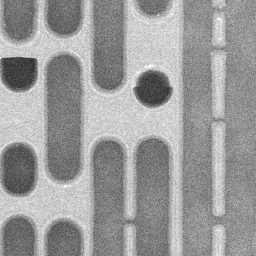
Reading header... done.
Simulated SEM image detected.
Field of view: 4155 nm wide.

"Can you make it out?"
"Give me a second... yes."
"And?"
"parallel lines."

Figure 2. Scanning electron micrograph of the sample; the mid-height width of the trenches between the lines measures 576 nm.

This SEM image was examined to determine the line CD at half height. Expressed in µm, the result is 0.128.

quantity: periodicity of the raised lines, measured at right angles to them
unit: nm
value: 725